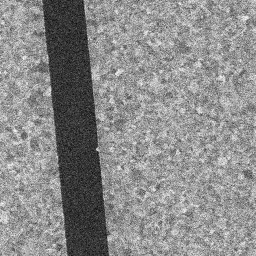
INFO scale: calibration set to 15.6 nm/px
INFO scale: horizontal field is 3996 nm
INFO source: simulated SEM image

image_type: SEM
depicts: one or a few lines or trenches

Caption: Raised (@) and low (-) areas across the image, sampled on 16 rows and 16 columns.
@@@--@@@@@@@@@@@
@@@--@@@@@@@@@@@
@@@---@@@@@@@@@@
@@@---@@@@@@@@@@
@@@---@@@@@@@@@@
@@@---@@@@@@@@@@
@@@---@@@@@@@@@@
@@@---@@@@@@@@@@
@@@---@@@@@@@@@@
@@@@--@@@@@@@@@@
@@@@--@@@@@@@@@@
@@@@--@@@@@@@@@@
@@@@--@@@@@@@@@@
@@@@---@@@@@@@@@
@@@@---@@@@@@@@@
@@@@---@@@@@@@@@